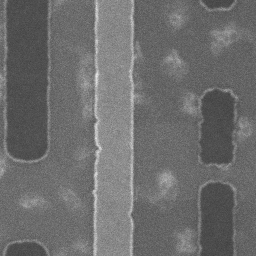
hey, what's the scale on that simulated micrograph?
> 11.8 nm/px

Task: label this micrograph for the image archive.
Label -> one or a few lines or trenches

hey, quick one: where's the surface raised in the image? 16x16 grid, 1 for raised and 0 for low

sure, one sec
1110001100000100
1110001100000000
1110001100000000
1110001100000000
1110001100000000
1110001100000000
1110001100000110
1110001100000110
1110001100001110
1110001100001110
0000001100000000
0000001100000100
0000001100001110
0000001100001110
0000001100001110
1110001100001110